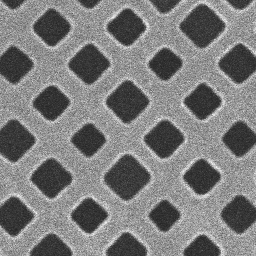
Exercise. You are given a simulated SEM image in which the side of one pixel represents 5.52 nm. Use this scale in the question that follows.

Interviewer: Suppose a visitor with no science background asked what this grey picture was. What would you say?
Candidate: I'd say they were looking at a regular array of holes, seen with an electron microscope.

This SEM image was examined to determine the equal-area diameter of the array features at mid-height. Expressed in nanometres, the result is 190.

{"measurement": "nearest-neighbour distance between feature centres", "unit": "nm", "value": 292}